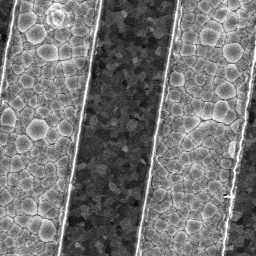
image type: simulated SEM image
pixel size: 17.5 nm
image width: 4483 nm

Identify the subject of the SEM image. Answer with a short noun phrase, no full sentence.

one or a few lines or trenches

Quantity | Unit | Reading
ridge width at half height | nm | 1340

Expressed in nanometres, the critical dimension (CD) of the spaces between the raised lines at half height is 1490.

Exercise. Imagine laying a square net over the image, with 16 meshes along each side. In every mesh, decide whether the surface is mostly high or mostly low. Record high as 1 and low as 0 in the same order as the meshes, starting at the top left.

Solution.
1000001111100000
1000001111100000
1000001111100000
0000001111100000
0000001111000000
0000011111000000
0000011111000001
0000011111000001
0000011111000001
0000011111000001
0000011110000001
0000111110000001
0000111110000011
0000111110000011
0000111110000011
0000111110000011